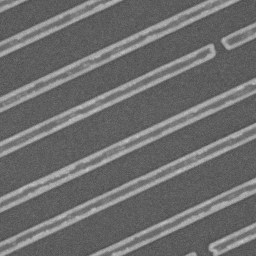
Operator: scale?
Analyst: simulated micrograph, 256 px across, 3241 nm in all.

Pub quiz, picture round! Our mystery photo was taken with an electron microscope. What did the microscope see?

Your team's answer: parallel lines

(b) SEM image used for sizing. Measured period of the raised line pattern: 571 nm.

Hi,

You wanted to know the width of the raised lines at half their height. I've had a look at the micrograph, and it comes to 10.9 px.